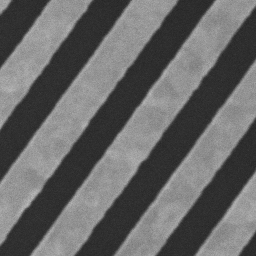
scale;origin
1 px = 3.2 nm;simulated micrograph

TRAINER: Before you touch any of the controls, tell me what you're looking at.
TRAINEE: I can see lines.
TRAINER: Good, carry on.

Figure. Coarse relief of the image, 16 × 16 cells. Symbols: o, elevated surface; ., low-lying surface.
...oo...ooo..ooo
..ooo..ooo..ooo.
.ooo..ooo...oo..
.oo...ooo..ooo..
ooo..ooo..ooo..o
oo..ooo..ooo...o
o...oo...ooo..oo
...ooo..ooo..ooo
..ooo..ooo...oo.
.ooo...oo...oo..
.oo...ooo..ooo..
ooo..ooo..ooo..o
oo..ooo...oo...o
o...oo...oo...oo
o..ooo..ooo..ooo
..ooo..ooo...oo.